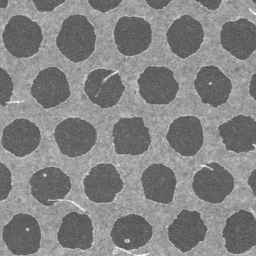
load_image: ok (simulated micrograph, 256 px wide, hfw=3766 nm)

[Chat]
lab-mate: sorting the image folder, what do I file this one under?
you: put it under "a regular array of holes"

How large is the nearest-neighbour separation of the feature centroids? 793 nanometers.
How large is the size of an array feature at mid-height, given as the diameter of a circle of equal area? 591 nanometres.